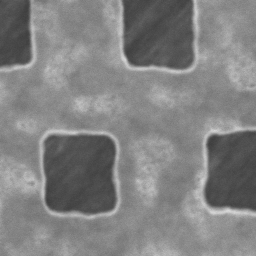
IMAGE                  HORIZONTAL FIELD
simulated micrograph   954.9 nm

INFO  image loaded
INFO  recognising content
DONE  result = holes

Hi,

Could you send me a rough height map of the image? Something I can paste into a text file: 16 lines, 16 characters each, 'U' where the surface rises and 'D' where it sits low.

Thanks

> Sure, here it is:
DDUUUUUUDDDDUUUU
DDUUUUUUDDDDUUUU
DDUUUUUUDDDDUUUU
DDUUUUUUDDDDUUUU
UUUUUUUUUUUUUUUU
UUUUUUUUUUUUUUUU
UUUUUUUUUUUUUUUU
UUUUUUUUUUUUUUUU
UUUDDDDUUUUUUDDD
UUUDDDDUUUUUUDDD
UUUDDDDUUUUUUDDD
UUUDDDDUUUUUUDDD
UUUDDDDUUUUUUDDD
UUUUUUUUUUUUUUUU
UUUUUUUUUUUUUUUU
UUUUUUUUUUUUUUUU